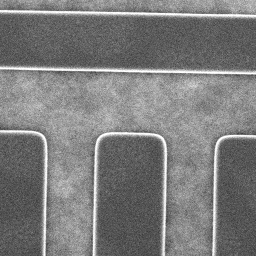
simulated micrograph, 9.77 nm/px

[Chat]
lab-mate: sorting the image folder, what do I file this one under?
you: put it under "groups of lines, slits or small figures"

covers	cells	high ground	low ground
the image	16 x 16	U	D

DDDDDDDDDDDDDDDD
UUUUUUUUUUUUUUUU
UUUUUUUUUUUUUUUU
UUUUUUUUUUUUUUUU
DDDDDDDDDUUUUUUU
DDDDDDDDDDDDDDDD
DDDDDDDDDDDDDDDD
DDDDDDDDDDDDDDDD
UUUDDDUUUUDDDDUU
UUUDDDUUUUDDDUUU
UUUDDDUUUUDDDUUU
UUUDDDUUUUDDDUUU
UUUDDDUUUUDDDUUU
UUUDDDUUUUDDDUUU
UUUDDDUUUUDDDUUU
UUUDDDUUUUDDDUUU